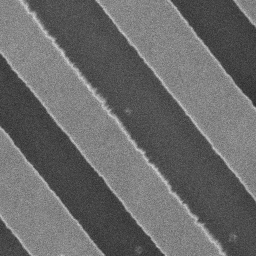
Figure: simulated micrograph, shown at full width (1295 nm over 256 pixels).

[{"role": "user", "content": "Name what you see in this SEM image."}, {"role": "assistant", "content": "lines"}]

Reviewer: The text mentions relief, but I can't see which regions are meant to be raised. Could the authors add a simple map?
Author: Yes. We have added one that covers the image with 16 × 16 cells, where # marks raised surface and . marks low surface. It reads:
##....#####....#
##.....#####....
###.....#####...
####.....####...
.####.....####..
..####....#####.
...###.....#####
...####.....####
#...####.....###
#....####.....##
##....####....##
###....###.....#
####....###.....
#####...####....
.####....####...
..####....####..